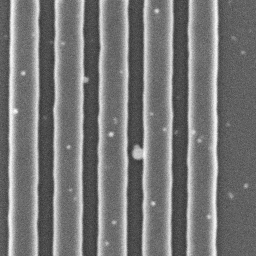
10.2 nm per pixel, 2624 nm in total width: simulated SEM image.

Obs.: groups of lines, slits or small figures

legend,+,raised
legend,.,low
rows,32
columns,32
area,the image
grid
.++++..+++...+++..++++..+++.....
.++++..+++...+++..++++..+++.....
.++++..+++...+++..++++..+++.....
.++++..+++...+++..++++..+++.....
.++++..+++...+++..++++..+++.....
.++++..+++...+++..+++...+++.....
.++++..+++...+++..++++..+++.....
.++++..+++...+++..++++..+++.....
.++++..+++...+++..+++...+++.....
.++++..+++...+++..+++...+++.....
.++++..+++...+++..+++...+++.....
.++++..+++...+++..+++...+++.....
.++++..+++...+++..+++...+++.....
.++++..+++...+++..+++...+++.....
.++++..+++..++++..++++..+++.....
.++++..+++..++++..+++...+++.....
.++++..+++...+++..+++...+++.....
.++++..+++..++++..+++...+++.....
.++++..+++..++++..+++...+++.....
.++++..+++..++++..+++...+++.....
.++++..+++..++++..+++...+++.....
.++++..+++..++++..+++...+++.....
.++++..+++..++++..+++...+++.....
.++++..+++..++++..+++...+++.....
.++++..+++..++++..+++...+++.....
.++++..+++..++++..+++...+++.....
.++++..+++..++++..+++..++++.....
.++++..+++..++++..+++...+++.....
.++++..+++..++++..+++..++++.....
.++++..+++..++++..+++..++++.....
.++++..+++..++++..+++..++++.....
.++++..+++..++++..+++..++++.....